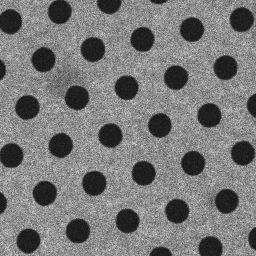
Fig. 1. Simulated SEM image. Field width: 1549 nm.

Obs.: a regular array of holes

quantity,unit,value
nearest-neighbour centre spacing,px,50.4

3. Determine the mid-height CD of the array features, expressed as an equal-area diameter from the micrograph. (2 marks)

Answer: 146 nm